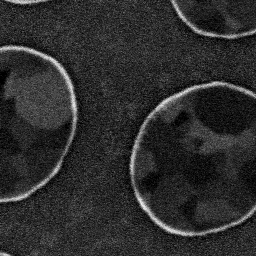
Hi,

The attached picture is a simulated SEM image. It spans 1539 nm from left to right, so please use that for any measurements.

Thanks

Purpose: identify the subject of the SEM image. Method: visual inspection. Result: raised bodies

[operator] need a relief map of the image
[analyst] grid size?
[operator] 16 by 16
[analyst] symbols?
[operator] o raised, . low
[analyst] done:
...........ooooo
............oooo
................
ooo.............
oooo............
oooo........ooo.
ooooo.....oooooo
ooooo....ooooooo
ooooo....ooooooo
oooo....oooooooo
oooo....oooooooo
ooo.....oooooooo
o........ooooooo
.........oooooo.
...........oo...
................